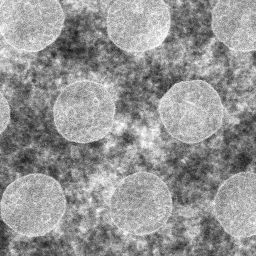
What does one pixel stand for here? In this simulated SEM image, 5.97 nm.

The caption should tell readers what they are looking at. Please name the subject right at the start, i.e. raised bodies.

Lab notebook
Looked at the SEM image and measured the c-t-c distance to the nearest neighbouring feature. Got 106 pixels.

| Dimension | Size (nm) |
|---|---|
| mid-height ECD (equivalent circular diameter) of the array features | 370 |